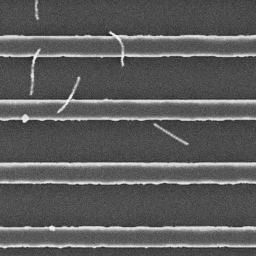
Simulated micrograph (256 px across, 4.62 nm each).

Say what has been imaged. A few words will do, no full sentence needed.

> lines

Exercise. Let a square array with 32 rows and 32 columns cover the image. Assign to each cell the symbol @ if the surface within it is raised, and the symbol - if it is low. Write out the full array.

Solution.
--------------------------------
--------------------------------
--------------------------------
--------------------------------
-------------@@@----------------
@@@@@@@@@@@@@@@@@@@@@@@@@@@@@@@@
@@@@@@@@@@@@@@@@@@@@@@@@@@@@@@@@
--------------------------------
--------------------------------
--------------------------------
--------------------------------
--------------------------------
--------@-----------------------
@@@@@@@@@@@@@@@@@@@@@@@@@@@@@@@@
@@@@@@@@@@@@@@@@@@@@@@@@@@@@@@@@
--------------------------------
--------------------------------
--------------------------------
--------------------------------
--------------------------------
-@-@@@@----@@@@@@@------@@-@@@--
@@@@@@@@@@@@@@@@@@@@@@@@@@@@@@@@
@@@@@@@@@@@@@@@@@@@@@@@@@@@@@@@@
--------------------------------
--------------------------------
--------------------------------
--------------------------------
--------------------------------
@@@@@@@@@@@@@@@@@@@@@@@@@@@@@@@@
@@@@@@@@@@@@@@@@@@@@@@@@@@@@@@@@
@@@@@@@@@@@@@@@@@@@@@@@@@@@@@@@@
--------------------------------